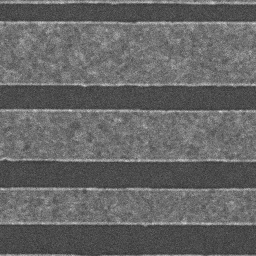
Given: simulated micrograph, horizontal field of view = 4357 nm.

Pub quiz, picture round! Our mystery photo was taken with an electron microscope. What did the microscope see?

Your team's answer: one or a few lines or trenches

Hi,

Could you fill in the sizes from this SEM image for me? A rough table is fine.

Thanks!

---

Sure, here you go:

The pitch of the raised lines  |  1300 nm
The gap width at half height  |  455 nm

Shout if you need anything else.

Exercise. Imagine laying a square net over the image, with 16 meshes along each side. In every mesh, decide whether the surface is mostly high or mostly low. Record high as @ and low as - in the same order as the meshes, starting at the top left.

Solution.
----------------
@@@@@@@@@@@@@@@@
@@@@@@@@@@@@@@@@
@@@@@@@@@@@@@@@@
@@@@@@@@@@@@@@@@
----------------
----------------
@@@@@@@@@@@@@@@@
@@@@@@@@@@@@@@@@
@@@@@@@@@@@@@@@@
----------------
----------------
@@@@@@@@@@@@@@@@
@@@@@@@@@@@@@@@@
----------------
----------------